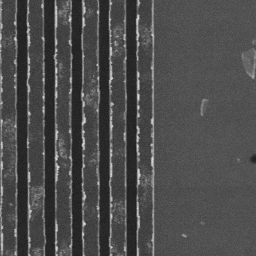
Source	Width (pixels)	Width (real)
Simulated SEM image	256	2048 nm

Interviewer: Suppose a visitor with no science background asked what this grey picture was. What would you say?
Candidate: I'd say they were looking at parallel lines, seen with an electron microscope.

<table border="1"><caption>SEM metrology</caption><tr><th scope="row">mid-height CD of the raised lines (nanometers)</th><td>133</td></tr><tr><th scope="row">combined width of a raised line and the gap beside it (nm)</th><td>218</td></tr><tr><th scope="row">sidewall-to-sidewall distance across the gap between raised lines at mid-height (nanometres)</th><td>86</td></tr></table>